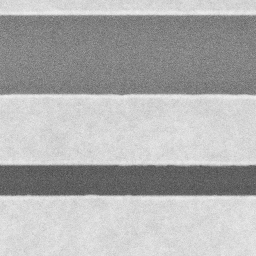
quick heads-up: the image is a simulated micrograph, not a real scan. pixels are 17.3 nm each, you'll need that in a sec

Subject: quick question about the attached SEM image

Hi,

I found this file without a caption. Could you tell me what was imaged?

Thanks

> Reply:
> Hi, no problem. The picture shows lines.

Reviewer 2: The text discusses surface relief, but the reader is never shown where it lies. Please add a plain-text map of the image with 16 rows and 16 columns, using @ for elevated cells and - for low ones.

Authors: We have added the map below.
@@@@@@@@@@@@@@@@
----------------
----------------
----------------
----------------
----------------
@@@@@@@@@@@@@@@@
@@@@@@@@@@@@@@@@
@@@@@@@@@@@@@@@@
@@@@@@@@@@@@@@@@
----------------
----------------
@@@@@@@@@@@@@@@@
@@@@@@@@@@@@@@@@
@@@@@@@@@@@@@@@@
@@@@@@@@@@@@@@@@